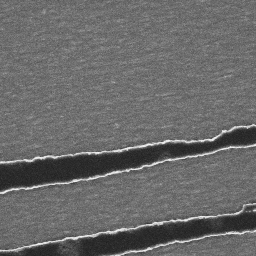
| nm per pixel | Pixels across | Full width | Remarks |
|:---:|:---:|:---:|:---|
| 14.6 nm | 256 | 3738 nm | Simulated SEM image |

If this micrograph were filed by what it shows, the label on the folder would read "one or a few lines or trenches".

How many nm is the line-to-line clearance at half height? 826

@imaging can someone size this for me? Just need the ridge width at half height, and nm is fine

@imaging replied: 334